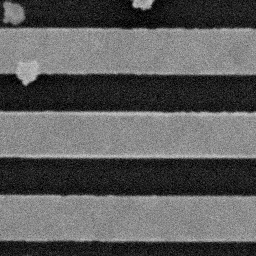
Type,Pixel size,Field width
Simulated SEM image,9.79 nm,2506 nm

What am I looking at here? lines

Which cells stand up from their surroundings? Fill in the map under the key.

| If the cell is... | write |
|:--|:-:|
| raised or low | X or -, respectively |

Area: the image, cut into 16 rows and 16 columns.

----------------
----------------
XXXXXXXXXXXXXXXX
XXXXXXXXXXXXXXXX
XXXXXXXXXXXXXXXX
----------------
----------------
XXXXXXXXXXXXXXXX
XXXXXXXXXXXXXXXX
XXXXXXXXXXXXXXXX
----------------
----------------
XXXXXXXXXXXXXXXX
XXXXXXXXXXXXXXXX
XXXXXXXXXXXXXXXX
----------------